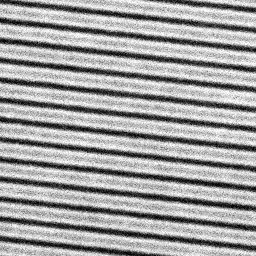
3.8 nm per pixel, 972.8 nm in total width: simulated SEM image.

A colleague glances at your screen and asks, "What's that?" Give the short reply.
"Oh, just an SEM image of parallel lines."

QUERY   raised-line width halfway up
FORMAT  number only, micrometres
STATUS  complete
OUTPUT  0.0491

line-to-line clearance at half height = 6.82 px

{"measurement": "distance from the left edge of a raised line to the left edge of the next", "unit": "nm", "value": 74.8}